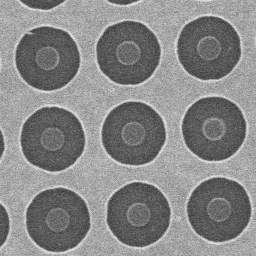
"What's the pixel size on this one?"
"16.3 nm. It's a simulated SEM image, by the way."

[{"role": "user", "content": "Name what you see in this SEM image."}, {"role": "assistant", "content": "an array of small figures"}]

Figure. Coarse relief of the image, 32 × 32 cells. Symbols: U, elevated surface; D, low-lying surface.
UUUDDDDDUUUUUUDDUUUUUUUUUUUUUUUU
UUUUUUUUUUUUUUUUUUUUUUUUUUUUUUUU
UUUUUUUUUUUUUUUUUUUUUUUUDDDDUUUU
UUUUDDDUUUUUUDDDDDDUUUUDDDDDDUUU
UUUDDDDDDUUUUDDDDDDDUUDDDDDDDDUU
UUDDDDDDDDUUDDDDDDDDUUDDDDDDDDUU
UUDDDDDDDDUUDDDDDDDDUUDDDDDDDDUU
UUDDDDDDDDUUDDDDDDDDUUDDDDDDDDUU
UUDDDDDDDDUUDDDDDDDDUUUDDDDDDUUU
UUDDDDDDDUUUUDDDDDDUUUUUDDDDUUUU
UUUDDDDDDUUUUUUDDDUUUUUUUUUUUUUU
UUUUUUUUUUUUUUUUUUUUUUUUUUUUUUUU
UUUUUUUUUUUUUUUUUUUUUUUUUDDDDUUU
UUUUUDDDUUUUUUDDDDDUUUUUDDDDDDUU
UUUUDDDDDDUUUDDDDDDDUUUDDDDDDDDU
UUUDDDDDDDUUUDDDDDDDDUUDDDDDDDDU
UUUDDDDDDDDUUDDDDDDDDUUDDDDDDDDU
DUDDDDDDDDDUUDDDDDDDDUUDDDDDDDDU
DUUDDDDDDDDUUDDDDDDDUUUDDDDDDDUU
UUUDDDDDDDUUUUDDDDDDUUUUDDDDDUUU
UUUUDDDDDUUUUUUDDDUUUUUUUUUUUUUU
UUUUUUDUUUUUUUUUUUUUUUUUUUUUUUUU
UUUUUUUUUUUUUUUUUUUUUUUUUUDDDUUU
UUUUUUDDUUUUUUUDDDDDUUUUDDDDDDDU
UUUUDDDDDDUUUUDDDDDDDUUUDDDDDDDU
UUUUDDDDDDDUUDDDDDDDDUUDDDDDDDDU
DUUDDDDDDDDUUDDDDDDDDUUDDDDDDDDU
DUUDDDDDDDDUUDDDDDDDDUUDDDDDDDDU
DUUDDDDDDDDUUUDDDDDDDUUUDDDDDDDU
DUUUDDDDDDDUUUDDDDDDUUUUUDDDDDUU
UUUUDDDDDDUUUUUDDDDUUUUUUUUUUUUU
UUUUUUDDUUUUUUUUUUUUUUUUUUUUUUUU